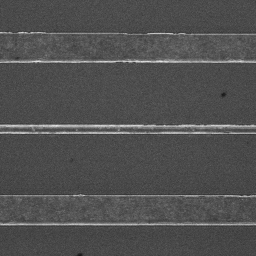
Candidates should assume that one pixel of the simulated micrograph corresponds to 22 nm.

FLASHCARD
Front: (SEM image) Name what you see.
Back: lines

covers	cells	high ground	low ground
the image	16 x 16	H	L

LLLLLLLLLLLLLLLL
LLLLLLLLLLLLLLLL
HHHHHHHHHHHHHHHH
HHHHHHHHHHHHHHHH
LLLLLLLLLLLLLLLL
LLLLLLLLLLLLLLLL
LLLLLLLLLLLLLLLL
LLLLLLLLLLLLLLLL
LLLLLLLLLLLLLLLL
LLLLLLLLLLLLLLLL
LLLLLLLLLLLLLLLL
LLLLLLLLLLLLLLLL
HHHHHHHHHHHHHHHH
HHHHHHHHHHHHHHHH
LLLLLLLLLLLLLLLL
LLLLLLLLLLLLLLLL